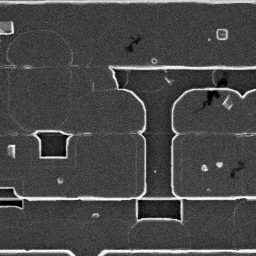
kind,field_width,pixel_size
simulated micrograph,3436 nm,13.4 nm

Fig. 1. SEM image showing wiring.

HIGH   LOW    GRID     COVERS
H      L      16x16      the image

HHHHHHHHHHHHHHHH
HHHHHHHHHHHHHHHH
HHHHHHHHHHHHHHHH
HHHHHHHHHHHHHHHH
HHHHHHHLLLLLLLLL
HHHHHHHHLLLLLLLL
HHHHHHHHHLLHHHHH
HHHHHHHHHLLHHHHH
HHHLHHHHHLLHHHHH
HHHLHHHHHLLHHHHH
HHHHHHHHHLLHHHHH
HHHHHHHHHLLHHHHH
LLLLLLLLLLLLLLLL
LLLLLLLLLLLLLLLL
LLLLLLLLLLLLLLLL
LLLLLLLLLLLLLLLL